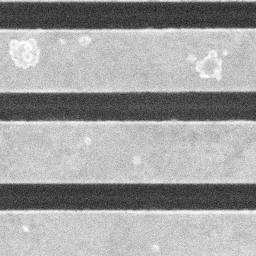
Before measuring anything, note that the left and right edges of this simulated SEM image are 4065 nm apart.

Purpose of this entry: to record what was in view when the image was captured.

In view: lines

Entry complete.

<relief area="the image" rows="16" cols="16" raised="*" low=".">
................
................
****************
****************
****************
****************
................
................
****************
****************
****************
................
................
****************
****************
****************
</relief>